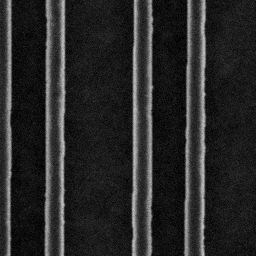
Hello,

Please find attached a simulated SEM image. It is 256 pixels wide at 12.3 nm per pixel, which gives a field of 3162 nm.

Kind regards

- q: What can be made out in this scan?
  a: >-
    lines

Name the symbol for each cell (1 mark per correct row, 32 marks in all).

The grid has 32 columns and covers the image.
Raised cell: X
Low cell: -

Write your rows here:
X-----XX---------XX-----XX------
X-----XX---------XX-----XX------
X-----XX---------XX-----XX------
X-----XX---------XX-----X-------
X-----XX---------XX-----X-------
X-----XX---------XX-----X-------
X-----XX---------XX-----X-------
X-----XX---------XX-----X-------
X-----XX---------XX-----X-------
X-----XX---------XX----XX-------
X-----XX---------XX----XX-------
X-----XX---------XX----XX-------
X-----XX---------XX----XX-------
X-----XX---------XX----XX-------
X-----XX---------XX----XX-------
X-----XX---------XX----XX-------
X-----XX---------XX----XX-------
X-----XX---------XX----XX-------
X-----XX---------XX----XX-------
X-----XX---------XX----XX-------
X-----XX---------XX----XX-------
X-----XX---------XX----XX-------
X-----XX---------XX----XX-------
X-----XX---------XX----XX-------
X-----XX---------XX----XX-------
X-----XX---------XX----XX-------
X-----XX---------XX----XX-------
X-----XX---------XX----XX-------
X-----XX---------XX----XX-------
X-----XX---------XX----XX-------
X-----XX---------XX----XX-------
X-----XX---------XX----XX-------